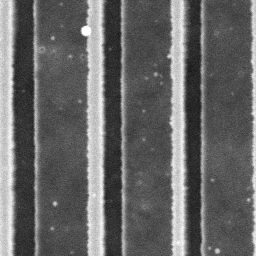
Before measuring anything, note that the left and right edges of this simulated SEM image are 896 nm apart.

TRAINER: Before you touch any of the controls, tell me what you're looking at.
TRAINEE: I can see lines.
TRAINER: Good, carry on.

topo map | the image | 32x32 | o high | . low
oo..ooooooooo..oooooooo..ooooooo
oo..ooooooooo..oooooooo..ooooooo
oo..ooooooooo..oooooooo..ooooooo
oo..ooooooooo..oooooooo..ooooooo
oo..ooooooooo..oooooooo..ooooooo
o...ooooooooo..oooooooo..ooooooo
o...ooooooooo..oooooooo..ooooooo
o...ooooooooo..oooooooo..ooooooo
o...ooooooooo..oooooooo..ooooooo
oo..ooooooooo..oooooooo..ooooooo
o...ooooooooo..oooooooo..ooooooo
o...ooooooooo..oooooooo..ooooooo
o...ooooooooo..oooooooo..ooooooo
o...ooooooooo..oooooooo..ooooooo
o...ooooooooo..oooooooo..ooooooo
o...ooooooooo..oooooooo..ooooooo
o...ooooooooo..oooooooo..ooooooo
o...ooooooooo..oooooooo..ooooooo
o...ooooooooo..oooooooo..ooooooo
o...ooooooooo..oooooooo..ooooooo
oo..ooooooooo..oooooooo..ooooooo
o...ooooooooo..oooooooo..ooooooo
o...ooooooooo..oooooooo..ooooooo
o...ooooooooo..oooooooo..ooooooo
o...ooooooooo..oooooooo..ooooooo
o...ooooooooo..oooooooo..ooooooo
o...ooooooooo..oooooooo..ooooooo
o...ooooooooo..oooooooo..ooooooo
o...ooooooooo..oooooooo..ooooooo
o...ooooooooo..oooooooo..ooooooo
o...ooooooooo..oooooooo..ooooooo
o...ooooooooo..oooooooo..ooooooo